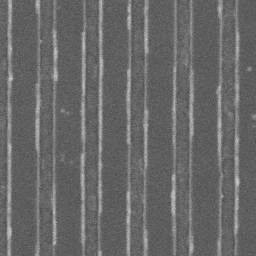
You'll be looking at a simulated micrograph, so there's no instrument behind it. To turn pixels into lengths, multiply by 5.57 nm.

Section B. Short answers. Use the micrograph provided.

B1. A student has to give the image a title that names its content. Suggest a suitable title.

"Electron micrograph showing parallel lines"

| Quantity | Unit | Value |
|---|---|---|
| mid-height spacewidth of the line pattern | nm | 77.2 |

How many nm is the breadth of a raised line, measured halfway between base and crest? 175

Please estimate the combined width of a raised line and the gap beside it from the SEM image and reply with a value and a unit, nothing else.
0.253 microns